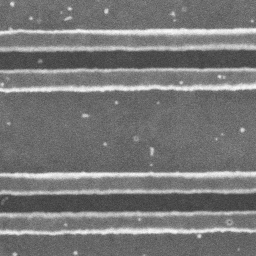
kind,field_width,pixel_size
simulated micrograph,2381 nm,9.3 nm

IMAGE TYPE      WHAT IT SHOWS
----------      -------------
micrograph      lines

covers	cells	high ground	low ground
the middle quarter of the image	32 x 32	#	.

................................
################################
################################
################################
################################
################################
########.#......................
................................
................................
................................
................................
................................
................................
................................
................................
................................
................................
................................
................................
................................
................................
................................
................................
................................
................................
................................
................................
..#.###...###.#....###########.#
################################
################################
################################
################################